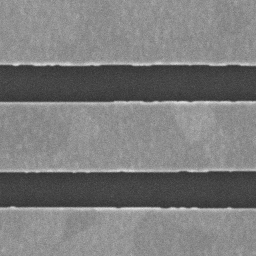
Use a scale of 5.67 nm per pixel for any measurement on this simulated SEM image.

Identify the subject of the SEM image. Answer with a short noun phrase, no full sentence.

lines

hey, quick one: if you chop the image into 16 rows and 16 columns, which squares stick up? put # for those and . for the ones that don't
################
################
################
################
................
................
################
################
################
################
################
................
................
################
################
################